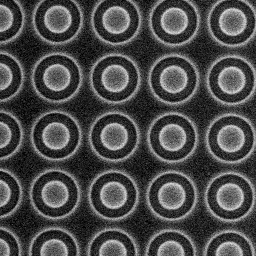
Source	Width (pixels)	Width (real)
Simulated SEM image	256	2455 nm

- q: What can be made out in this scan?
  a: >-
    an array of small figures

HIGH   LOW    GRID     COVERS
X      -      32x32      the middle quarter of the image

---XXXXX----XX----XXXXX---------
X---XXX---XXXXX---XXXX---XXXXX--
X---XXX---XXXXXX--XXXX--XXXXXX--
X---XXX---XXXXXX---XXX--XXXXXXX-
X---XXX---XXXXXX--XXXX--XXXXXXX-
X---XXX---XXXXX---XXXX---XXXXX--
---XXXXX---XXX----XXXX---XXXX---
--XXXXXXX--------XXXXXX---------
-XXXXXXXXX------XXXXXXXX-------X
XXXXXXXXXXXXXXXXXXXXXXXXXX---XXX
XXXXXXXXXXXXXXXXXXXXXXXXXXXXXXXX
XXXXXXXXXXXXXXXXXXXXXXXXXXXXXXXX
XXXXXXXXXXX--XXXXXXXXXXXXXXXXXXX
--XXXXXXX-------XXXXXXXX------XX
---XXXXX---------XXXXXX--------X
---XXXX----XXX----XXXX----XXX---
X---XXX---XXXXX---XXXX--XXXXXX--
X---XXX--XXXXXXX--XXX---XXXXXX--
X---XXX--XXXXXXX--XXX---XXXXXX--
X---XXX---XXXXXX--XXX---XXXXXX--
---XXXX---XXXXX---XXXX---XXXXX--
---XXXXX---------XXXXX----XX----
--XXXXXXX-------XXXXXXX--------X
XXXXXXXXXX-----XXXXXXXXX------XX
XXXXXXXXXXXXXXXXXXXXXXXXXXXXXXXX
XXXXXXXXXXXXXXXXXXXXXXXXXXXXXXXX
XXXXXXXXXXXXXXXXXXXXXXXXXXXXXXXX
XXXXXXXXXX----XXXXXXXXXXX----XXX
--XXXXXXX-------XXXXXXX--------X
---XXXXX---------XXXXX----------
---XXXX---XXXXX---XXXX---XXXX---
X--XXXX--XXXXXX---XXX---XXXXXX--